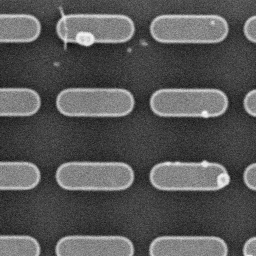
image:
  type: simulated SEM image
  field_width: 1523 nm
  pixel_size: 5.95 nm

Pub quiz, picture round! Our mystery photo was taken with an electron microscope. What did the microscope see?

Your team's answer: groups of lines, slits or small figures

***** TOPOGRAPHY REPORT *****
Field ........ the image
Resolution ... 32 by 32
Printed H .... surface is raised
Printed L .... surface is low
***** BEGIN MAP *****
LLLLLLLLLLLLLLLLLLLLLLLLLLLLLLLL
LLLLLLLLLLLLLLLLLLLLLLLLLLLLLLLL
HHHHLLLLHHHHHHHHLLLHHHHHHHHHLLLH
HHHHHLLHHHHHHHHHHLLHHHHHHHHHLLLH
HHHHHLLLHHHHHHHHLLLHHHHHHHHHLLLH
LLLLLLLLLLHLLLLLLLLLLLLLLLLLLLLL
LLLLLLLLLLLLLLLLLLLLLLLLLLLLLLLL
LLLLLLLLLLLLLLLLLLLLLLLLLLLLLLLL
LLLLLLLLLLLLLLLLLLLLLLLLLLLLLLLL
LLLLLLLLLLLLLLLLLLLLLLLLLLLLLLLL
LLLLLLLLLLLLLLLLLLLLLLLLLLLLLLLL
HHHHLLLLHHHHHHHHLLLLHHHHHHHHLLLH
HHHHHLLHHHHHHHHHHLLHHHHHHHHHLLLH
HHHHHLLHHHHHHHHHLLLHHHHHHHHHLLLH
LLLLLLLLLLLLLLLLLLLLLLLLLHLLLLLL
LLLLLLLLLLLLLLLLLLLLLLLLLLLLLLLL
LLLLLLLLLLLLLLLLLLLLLLLLLLLLLLLL
LLLLLLLLLLLLLLLLLLLLLLLLLLLLLLLL
LLLLLLLLLLLLLLLLLLLLLLLLLLLLLLLL
LLLLLLLLLLLLLLLLLLLLLLLLLLLLLLLL
HHHHLLLLHHHHHHHLLLLLHHHHHHHLLLLL
HHHHHLLHHHHHHHHHLLLHHHHHHHHHLLLH
HHHHHLLHHHHHHHHHLLLHHHHHHHHHHLLH
HHHHLLLLHHHHHHHLLLLLHHHHHHHLLLLL
LLLLLLLLLLLLLLLLLLLLLLLLLLLLLLLL
LLLLLLLLLLLLLLLLLLLLLLLLLLLLLLLL
LLLLLLLLLLLLLLLLLLLLLLLLLLLLLLLL
LLLLLLLLLLLLLLLLLLLLLLLLLLLLLLLL
LLLLLLLLLLLLLLLLLLLLLLLLLLLLLLLL
LLLLLLLLLLLLLLLLLLLLLLLLLLLLLLLL
HHHHHLLHHHHHHHHHLLLHHHHHHHHHLLLH
HHHHHLLHHHHHHHHHHLLHHHHHHHHHLLLH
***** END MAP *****